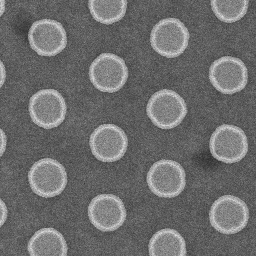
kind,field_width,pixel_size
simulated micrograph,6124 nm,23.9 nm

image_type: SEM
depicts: a regular array of raised bodies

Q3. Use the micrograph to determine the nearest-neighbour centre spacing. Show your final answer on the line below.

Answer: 1.65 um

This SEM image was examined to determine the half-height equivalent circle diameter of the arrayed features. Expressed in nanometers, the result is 848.